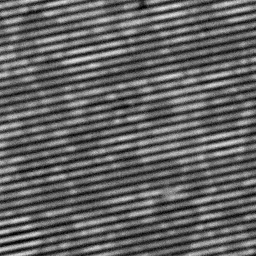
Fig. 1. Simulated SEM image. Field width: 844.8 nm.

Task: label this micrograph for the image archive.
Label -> parallel lines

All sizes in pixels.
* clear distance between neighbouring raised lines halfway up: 2.58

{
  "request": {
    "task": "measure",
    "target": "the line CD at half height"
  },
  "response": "19.4 nm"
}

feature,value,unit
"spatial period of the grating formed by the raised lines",0.0282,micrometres